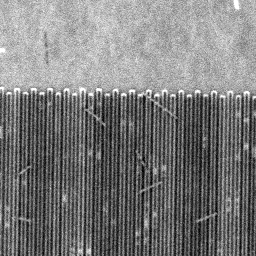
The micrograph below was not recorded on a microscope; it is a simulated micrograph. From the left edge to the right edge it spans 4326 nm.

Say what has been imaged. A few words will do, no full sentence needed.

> parallel lines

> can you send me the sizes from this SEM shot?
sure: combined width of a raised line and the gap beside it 138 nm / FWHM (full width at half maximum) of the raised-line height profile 0.0697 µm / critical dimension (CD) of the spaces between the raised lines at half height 69.7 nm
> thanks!